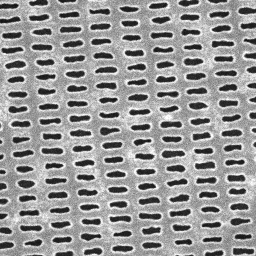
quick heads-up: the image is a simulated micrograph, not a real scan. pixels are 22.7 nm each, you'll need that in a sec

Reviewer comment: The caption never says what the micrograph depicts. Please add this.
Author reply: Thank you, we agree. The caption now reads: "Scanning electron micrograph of a regular array of holes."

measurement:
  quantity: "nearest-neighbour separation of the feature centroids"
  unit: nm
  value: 333